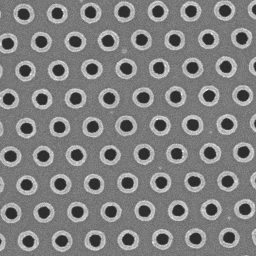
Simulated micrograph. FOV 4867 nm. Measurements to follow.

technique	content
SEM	a regular array of ring-shaped raised bodies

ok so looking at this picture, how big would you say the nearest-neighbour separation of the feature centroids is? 0.615 µm